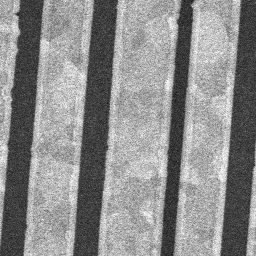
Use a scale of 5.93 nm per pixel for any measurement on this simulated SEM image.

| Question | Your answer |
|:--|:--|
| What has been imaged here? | one or a few lines or trenches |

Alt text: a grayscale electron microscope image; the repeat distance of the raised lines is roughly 74.4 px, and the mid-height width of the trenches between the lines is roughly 177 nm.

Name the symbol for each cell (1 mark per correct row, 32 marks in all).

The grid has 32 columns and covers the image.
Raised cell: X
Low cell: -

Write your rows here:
XX----XXXXX----XXXXXXX--XXXXXX--
XX----XXXXX----XXXXXXX---XXXXX--
XX----XXXXX----XXXXXXX---XXXX---
XX----XXXXX----XXXXXXX--XXXXX---
XX----XXXXX----XXXXXXX--XXXXX---
XX---XXXXXX----XXXXXXX--XXXXX---
XX---XXXXXX----XXXXXXX--XXXXX---
X----XXXXXX----XXXXXXX--XXXXX---
X----XXXXXX---XXXXXXX---XXXXX---
X----XXXXX----XXXXXXX---XXXXX---
X----XXXXX----XXXXXXX---XXXXX---
X----XXXXX----XXXXXXX---XXXXX---
X----XXXXX----XXXXXXX---XXXXX---
X----XXXXX----XXXXXXX---XXXXX---
X----XXXXX----XXXXXXX---XXXX----
X----XXXXX----XXXXXXX--XXXXX----
X----XXXXX----XXXXXXX--XXXXX----
X---XXXXXX----XXXXXXX--XXXXX----
X---XXXXXX----XXXXXXX--XXXXX----
X---XXXXXX----XXXXXXX--XXXXX----
----XXXXXX----XXXXXXX--XXXXX----
----XXXXX-----XXXXXX---XXXXX----
----XXXXX----XXXXXXX---XXXXX----
----XXXXX----XXXXXXX---XXXXX----
----XXXXX----XXXXXXX---XXXXX----
----XXXXX----XXXXXXX---XXXXX----
----XXXXX----XXXXXXX---XXXXX----
----XXXXX----XXXXXXX--XXXXXX----
----XXXXX----XXXXXXX--XXXXX----X
----XXXXX----XXXXXXX--XXXXX----X
----XXXXX----XXXXXXX--XXXXX----X
---XXXXXX----XXXXXXX--XXXXX----X